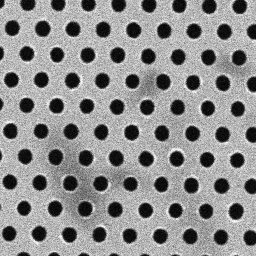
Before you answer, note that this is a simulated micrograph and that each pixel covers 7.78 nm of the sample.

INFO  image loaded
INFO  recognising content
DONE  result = a regular array of holes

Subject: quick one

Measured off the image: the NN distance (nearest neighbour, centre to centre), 230 nm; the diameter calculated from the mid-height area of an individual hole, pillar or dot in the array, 117 nanometres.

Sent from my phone